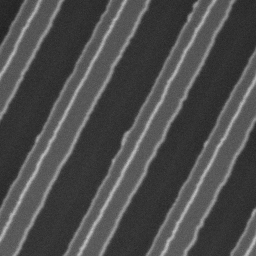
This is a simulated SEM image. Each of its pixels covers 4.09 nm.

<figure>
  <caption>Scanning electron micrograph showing lines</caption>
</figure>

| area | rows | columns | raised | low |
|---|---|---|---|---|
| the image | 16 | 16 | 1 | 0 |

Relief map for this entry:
0111000110001100
0110001110001100
1110001100011000
1100011000011000
1100011000110001
1000110000110001
0001110001100011
0001100001100011
0011100011000110
0011000111000110
0111000110001100
0110001110001100
1110001100011000
1100011100111000
1100011000110001
1000111001110001